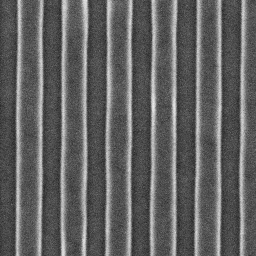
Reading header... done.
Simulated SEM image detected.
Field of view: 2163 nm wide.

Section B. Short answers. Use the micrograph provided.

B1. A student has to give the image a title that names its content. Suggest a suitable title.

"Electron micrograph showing wiring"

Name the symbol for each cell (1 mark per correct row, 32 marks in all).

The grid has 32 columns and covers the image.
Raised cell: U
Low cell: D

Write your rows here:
DDUUUDDDUUUDDDUUDDDUUUDDDUUUDDUU
DDUUUDDDUUUDDDUUDDDUUUDDDUUUDDUU
DDUUUDDDUUUDDDUUDDDUUUDDDUUUDDUU
DDUUUDDDUUUDDDUUDDDUUUDDDUUUDDUU
DDUUUDDDUUUDDDUUDDDUUUDDDUUUDDUU
DDUUUDDDUUUDDDUUDDDUUUDDDUUUDDUU
DDUUUDDDUUUDDDUUDDDUUUDDDUUUDDUU
DDUUUDDDUUUDDDUUDDDUUUDDDUUUDDUU
DDUUUDDDUUUDDDUUDDDUUUDDDUUUDDUU
DDUUUDDDUUUDDDUUDDDUUUDDDUUUDDUU
DDUUUDDDUUUDDDUUDDDUUUDDDUUUDDUU
DDUUUDDDUUUDDDUUDDDUUUDDDUUUDDUU
DDUUUDDDUUUDDUUUDDDUUUDDDUUUDDUU
DDUUUDDDUUUDDUUUDDDUUUDDDUUUDDUU
DDUUUDDDUUUDDUUUDDDUUUDDDUUUDDUU
DDUUUDDDUUUDDUUUDDDUUUDDDUUUDDUU
DDUUUDDDUUUDDUUUDDDUUUDDDUUUDDUU
DDUUUDDDUUUDDUUUDDDUUUDDDUUUDDUU
DDUUUDDDUUUDDUUUDDDUUUDDDUUDDDUU
DDUUUDDDUUUDDUUUDDDUUUDDDUUDDDUU
DDUUUDDDUUUDDUUUDDDUUUDDDUUDDDUU
DDUUUDDDUUUDDUUUDDDUUUDDDUUUDDUU
DDUUUDDDUUUDDUUUDDDUUUDDDUUUDDUU
DDUUUDDDUUUDDUUUDDDUUUDDDUUUDDUU
DDUUUDDDUUUDDUUUDDDUUUDDUUUUDDUU
DDUUUDDDUUUDDUUUDDDUUUDDUUUUDDUU
DDUUUDDDUUUDDUUUDDDUUUDDUUUUDDUU
DDUUUDDDUUUDDUUUDDDUUUDDUUUDDDUU
DDUUUDDDUUUDDUUUDDDUUUDDUUUDDDUU
DDUUUDDDUUUDDUUUDDDUUUDDUUUDDDUU
DDUUUDDDUUUDDUUUDDDUUUDDUUUDDDUU
DDUUUDDDUUUDDUUUDDDUUUDDUUUDDDUU